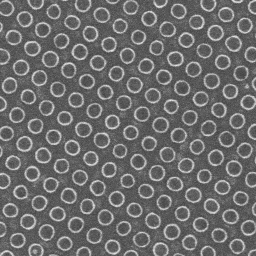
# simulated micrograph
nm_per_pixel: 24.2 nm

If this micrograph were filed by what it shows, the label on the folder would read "a regular array of raised bodies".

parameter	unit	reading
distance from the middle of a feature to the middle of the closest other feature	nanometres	511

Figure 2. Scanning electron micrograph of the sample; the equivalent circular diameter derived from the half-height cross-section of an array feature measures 346 nm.